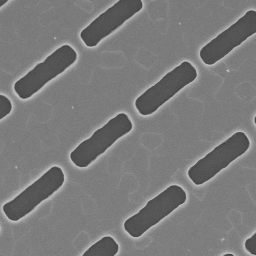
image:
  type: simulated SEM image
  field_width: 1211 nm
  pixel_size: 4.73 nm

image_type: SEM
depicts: holes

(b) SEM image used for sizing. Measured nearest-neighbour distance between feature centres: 392 nm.